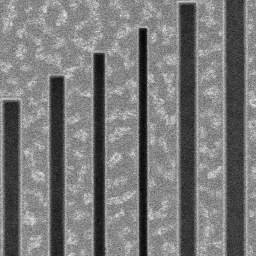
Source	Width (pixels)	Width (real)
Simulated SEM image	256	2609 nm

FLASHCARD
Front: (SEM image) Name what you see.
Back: parallel lines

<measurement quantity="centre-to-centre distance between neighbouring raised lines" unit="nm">452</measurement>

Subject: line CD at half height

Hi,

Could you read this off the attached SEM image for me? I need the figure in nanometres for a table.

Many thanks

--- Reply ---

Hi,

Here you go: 309